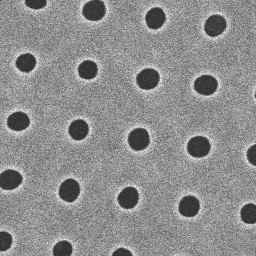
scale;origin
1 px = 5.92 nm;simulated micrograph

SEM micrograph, a regular array of holes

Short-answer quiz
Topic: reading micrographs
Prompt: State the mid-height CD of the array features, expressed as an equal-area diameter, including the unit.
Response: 130 nm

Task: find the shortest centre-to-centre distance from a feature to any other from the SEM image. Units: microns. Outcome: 0.353